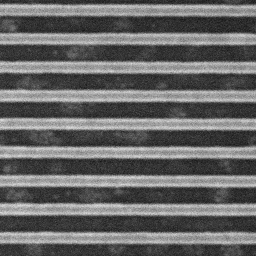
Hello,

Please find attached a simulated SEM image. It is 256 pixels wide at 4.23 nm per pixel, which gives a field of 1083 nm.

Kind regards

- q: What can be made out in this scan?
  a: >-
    parallel lines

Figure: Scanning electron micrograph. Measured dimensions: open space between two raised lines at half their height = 80.3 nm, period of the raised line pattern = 0.12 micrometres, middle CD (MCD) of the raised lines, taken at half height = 40.2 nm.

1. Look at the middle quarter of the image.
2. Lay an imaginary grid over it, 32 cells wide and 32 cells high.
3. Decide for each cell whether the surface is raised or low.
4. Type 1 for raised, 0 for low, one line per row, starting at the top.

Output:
11111111111111111111111111111111
11111111111111111111111111111111
00000000000000000000000000000000
00000000000000000000000000000000
00000000000000000000000000000000
00000000000000000000000000000000
00000000000000000000000000000000
11111111111111111111111111111111
11111111111111111111111111111111
00000000000000000000000000000000
00000000000000000000000000000000
00000000000000000000000000000000
00000000000000000000000000000000
00000000000000000000000000000000
11111111111111111111111111111111
11111111111111111111111111111111
00000000000000000000000000000000
00000000000000000000000000000000
00000000000000000000000000000000
00000000000000000000000000000000
00000000000000000000000000000000
11111111111111111111111111111111
11111111111111111111111111111111
00000000000000000000000000000000
00000000000000000000000000000000
00000000000000000000000000000000
00000000000000000000000000000000
00000000000000000000000000000000
11111111111111111111111111111111
11111111111111111111111111111111
00000000000001000000000000000000
00000000000000000000000000000000